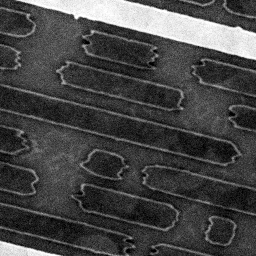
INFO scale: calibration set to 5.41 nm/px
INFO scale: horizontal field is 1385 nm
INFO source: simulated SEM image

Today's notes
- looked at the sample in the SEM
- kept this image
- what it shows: parallel lines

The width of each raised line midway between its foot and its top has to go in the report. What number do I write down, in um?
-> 0.132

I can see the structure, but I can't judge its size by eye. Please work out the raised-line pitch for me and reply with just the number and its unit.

205 nm